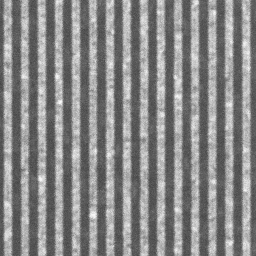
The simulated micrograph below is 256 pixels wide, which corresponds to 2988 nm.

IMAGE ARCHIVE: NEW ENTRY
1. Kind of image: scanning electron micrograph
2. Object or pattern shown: parallel lines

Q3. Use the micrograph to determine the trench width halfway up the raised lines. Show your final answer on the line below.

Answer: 0.128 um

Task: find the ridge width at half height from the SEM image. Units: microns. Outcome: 0.0744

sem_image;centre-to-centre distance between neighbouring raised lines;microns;0.199